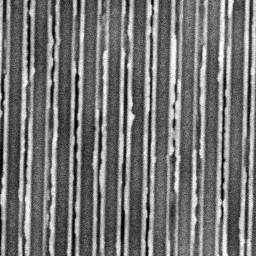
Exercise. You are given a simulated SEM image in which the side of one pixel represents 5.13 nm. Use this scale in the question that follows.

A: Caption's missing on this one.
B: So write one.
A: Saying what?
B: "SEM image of parallel lines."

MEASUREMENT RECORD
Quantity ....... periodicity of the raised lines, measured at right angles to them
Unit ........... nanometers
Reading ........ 126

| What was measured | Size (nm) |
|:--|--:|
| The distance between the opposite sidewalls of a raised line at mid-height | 53.2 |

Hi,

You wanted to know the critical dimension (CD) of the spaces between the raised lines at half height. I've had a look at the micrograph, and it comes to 72.4 nm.